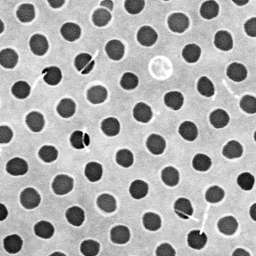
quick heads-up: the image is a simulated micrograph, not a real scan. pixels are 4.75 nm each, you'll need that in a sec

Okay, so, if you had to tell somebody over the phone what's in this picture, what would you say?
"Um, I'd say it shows a regular array of holes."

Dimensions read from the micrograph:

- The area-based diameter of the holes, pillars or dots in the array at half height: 0.098 um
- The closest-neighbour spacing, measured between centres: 161 nanometres